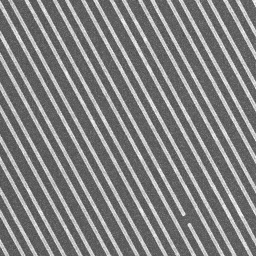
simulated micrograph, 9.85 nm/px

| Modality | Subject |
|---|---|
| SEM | parallel lines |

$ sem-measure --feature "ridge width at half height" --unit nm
28.1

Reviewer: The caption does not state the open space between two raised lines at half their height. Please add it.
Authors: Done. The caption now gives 0.0811 micrometres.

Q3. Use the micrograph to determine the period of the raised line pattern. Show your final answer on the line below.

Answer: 123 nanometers